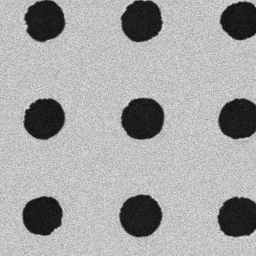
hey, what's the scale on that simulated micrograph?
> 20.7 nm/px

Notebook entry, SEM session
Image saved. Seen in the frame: holes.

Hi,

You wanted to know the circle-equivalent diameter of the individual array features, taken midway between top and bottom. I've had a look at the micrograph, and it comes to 866 nanometers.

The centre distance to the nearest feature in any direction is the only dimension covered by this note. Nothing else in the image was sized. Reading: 2010 nm